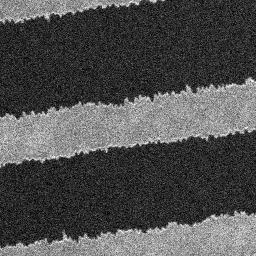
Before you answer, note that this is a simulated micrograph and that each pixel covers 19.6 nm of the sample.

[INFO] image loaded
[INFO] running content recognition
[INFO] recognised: one or a few lines or trenches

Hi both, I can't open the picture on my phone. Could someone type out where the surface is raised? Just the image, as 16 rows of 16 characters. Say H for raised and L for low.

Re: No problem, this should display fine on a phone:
HHHHHHLLLLLLLLLL
LLLLLLLLLLLLLLLL
LLLLLLLLLLLLLLLL
LLLLLLLLLLLLLLLL
LLLLLLLLLLLLLLLL
LLLLLLLLLLLLLHHH
LLLLLLLLHHHHHHHH
HHHHHHHHHHHHHHHH
HHHHHHHHHHHHHLLL
HHHHHLLLLLLLLLLL
LLLLLLLLLLLLLLLL
LLLLLLLLLLLLLLLL
LLLLLLLLLLLLLLLL
LLLLLLLLLLLLLLHH
LLLLLLLLHHHHHHHH
HHHHHHHHHHHHHHHH